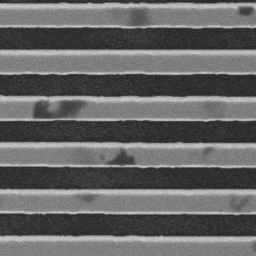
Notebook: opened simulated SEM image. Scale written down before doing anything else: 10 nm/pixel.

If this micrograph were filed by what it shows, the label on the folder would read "lines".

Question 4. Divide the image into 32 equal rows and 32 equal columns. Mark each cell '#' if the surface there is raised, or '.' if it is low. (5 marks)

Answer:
................................
################################
################################
................................
................................
................................
################################
################################
################################
................................
................................
................................
################################
################################
################################
................................
................................
................................
################################
################################
################################
................................
................................
................................
################################
################################
################################
................................
................................
................................
################################
################################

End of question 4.